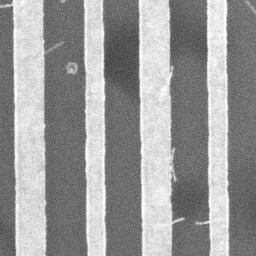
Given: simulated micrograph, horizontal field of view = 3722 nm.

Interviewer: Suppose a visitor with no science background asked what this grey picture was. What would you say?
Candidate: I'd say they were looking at lines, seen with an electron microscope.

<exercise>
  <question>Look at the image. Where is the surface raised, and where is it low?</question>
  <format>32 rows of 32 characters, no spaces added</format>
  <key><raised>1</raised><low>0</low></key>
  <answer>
00111000000110000011100000110000
00111000000110000011100000110000
00111000000110000011100000110000
00111000000110000011100000110000
00111000000110000011100000110000
00111000000110000011100000110000
00111000000110000011100000110000
00111000000110000011100000110000
00111000000110000011100000110000
00111000000110000011100000110000
00111000000110000011100000110000
00111000000110000011100000110000
00111000000110000011100000110000
00111000000110000011100000110000
00111000000110000011100000110000
00111100000110000011100000110000
00111000000110000011100000110000
00111100000110000011100000110000
00111100000110000011100000110000
00111100000110000011100000110000
00111100000110000011100000110000
00111100000110000011100000110000
00111100000110000011100000110000
00111100000110000011100000110000
00111100000110000011100000110000
00111100000110000011100000110000
00111100000110000011100000110000
00111100000110000011100000110000
00111100000110000011100000110000
00111100000110000011100000110000
00111100000110000011100000110000
00111100000110000011100000110000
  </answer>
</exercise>